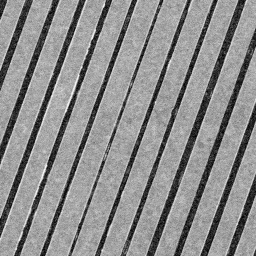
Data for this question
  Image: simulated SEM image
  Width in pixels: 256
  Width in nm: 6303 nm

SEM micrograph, parallel lines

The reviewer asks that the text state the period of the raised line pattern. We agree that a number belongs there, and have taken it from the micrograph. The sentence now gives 25 pixels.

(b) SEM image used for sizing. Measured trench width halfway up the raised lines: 159 nanometres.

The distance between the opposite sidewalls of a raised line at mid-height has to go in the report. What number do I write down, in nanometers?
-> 455